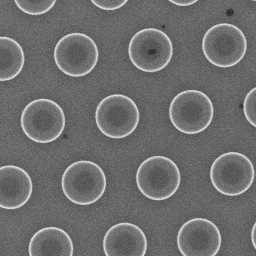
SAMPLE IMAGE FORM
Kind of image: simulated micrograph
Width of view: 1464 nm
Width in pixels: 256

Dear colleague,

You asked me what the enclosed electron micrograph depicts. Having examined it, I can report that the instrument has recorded an array of small figures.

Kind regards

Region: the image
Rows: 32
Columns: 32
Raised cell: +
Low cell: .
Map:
..+++++.....+++.......++........
...+++..........................
................................
..........................++++..
........+++......++++.....++++..
++.....+++++....+++++....++++++.
+++....+++++....++++++....+++++.
+++....+++++....+++++.....++++..
+++....+++++.....+++............
++.......+......................
................................
.......................++......+
.....+.......+++......++++.....+
...+++++....+++++....++++++....+
...+++++....+++++....++++++....+
...+++++....+++++.....++++.....+
...+++++.....+++.......++.......
....+++.........................
................................
............................++..
.........+++......++++.....++++.
+++.....+++++....+++++....++++++
++++....+++++....+++++....++++++
++++....+++++....+++++.....++++.
++++....+++++.....+++...........
+++.......+.....................
................................
........................++......
......+.......+++......++++.....
....+++++....+++++....++++++....
....+++++....+++++....++++++....
....+++++....+++++.....++++.....